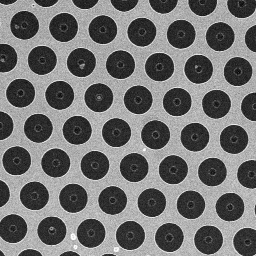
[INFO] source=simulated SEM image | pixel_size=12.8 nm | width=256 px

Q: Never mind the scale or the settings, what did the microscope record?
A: an array of small figures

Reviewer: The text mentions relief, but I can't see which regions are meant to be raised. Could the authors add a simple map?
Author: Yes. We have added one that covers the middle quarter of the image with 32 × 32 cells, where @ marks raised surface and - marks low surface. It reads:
@---@---@@--------@@--------@@--
@-------@@@-------@@--------@@--
@@-----@@@@------@@@@------@@@--
@@@@-@@@@@@@@---@@@@@-----@@@@@-
-@@@@@@@@@@@@@@@@@@@@@@@@@@@@@@@
--@@@@-----@@@@@@@--@@@@@@@@@@@@
--@@@-------@@@@-----@@@@@----@@
---@@-------@@@-------@@@-------
---@@--------@@-------@@@-------
--@@@-------@@@-------@@@-------
--@@@@------@@@-------@@@-------
@@@@@@@----@@@@@-----@@@@-------
@@@@@@@@@@@@@@@@@---@@@@@@-----@
@----@@@@@@@--@@@@@@@@@@@@@@@@@@
------@@@@------@@@@@----@@@@@@@
-------@@@------@@@@------@@@@--
-------@@--------@@-------@@@---
-------@@--------@@--------@@---
-------@@@-------@@--------@@---
@-----@@@@------@@@@------@@@---
@@@@@@@@@@@----@@@@@-----@@@@@--
@@@@@@@@@@@@@@@@@@@@@@-@@@@@@@@-
-@@@@-----@@@@@@---@@@@@@@@@@@@@
-@@@@------@@@@-----@@@@@-----@@
--@@-------@@@-------@@@-------@
--@@-------@@@-------@@@-------@
-@@@-------@@@-------@@--------@
-@@@@------@@@-------@@@-------@
@@@@@@----@@@@@-----@@@@------@@
@@@@@@@@@@@@@@@@@--@@@@@@----@@@
----@@@@@@@--@@@@@@@@@@@@@@@@@@@
-----@@@@@-----@@@@@----@@@@@@@@